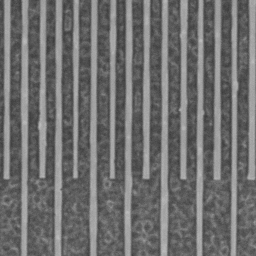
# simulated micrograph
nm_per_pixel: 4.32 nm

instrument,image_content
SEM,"parallel lines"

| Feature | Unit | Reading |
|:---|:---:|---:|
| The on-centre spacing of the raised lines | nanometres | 75.5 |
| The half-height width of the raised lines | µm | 0.0248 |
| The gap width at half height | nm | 54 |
